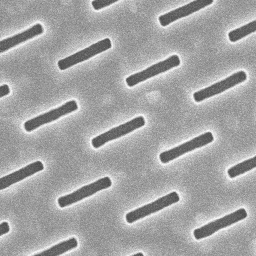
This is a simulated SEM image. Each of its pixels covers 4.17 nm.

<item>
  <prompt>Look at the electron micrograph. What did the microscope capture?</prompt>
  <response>a regular array of holes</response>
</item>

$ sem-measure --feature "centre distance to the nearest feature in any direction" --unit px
69.1